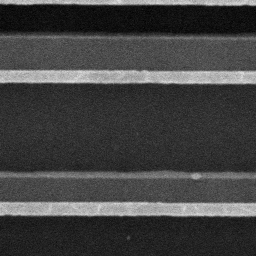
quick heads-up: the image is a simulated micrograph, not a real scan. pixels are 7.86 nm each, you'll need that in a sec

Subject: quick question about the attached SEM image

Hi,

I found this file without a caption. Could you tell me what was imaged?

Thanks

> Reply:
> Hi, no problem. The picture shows lines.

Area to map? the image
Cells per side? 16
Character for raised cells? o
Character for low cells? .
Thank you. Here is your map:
................
................
oooooooooooooooo
oooooooooooooooo
oooooooooooooooo
................
................
................
................
................
................
oooooooooooooooo
oooooooooooooooo
................
................
................